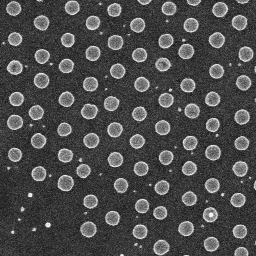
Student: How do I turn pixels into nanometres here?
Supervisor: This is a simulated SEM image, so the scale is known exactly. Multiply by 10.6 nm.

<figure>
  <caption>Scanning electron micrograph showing a regular array of raised bodies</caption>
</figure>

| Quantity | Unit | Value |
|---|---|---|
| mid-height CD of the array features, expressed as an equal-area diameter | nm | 150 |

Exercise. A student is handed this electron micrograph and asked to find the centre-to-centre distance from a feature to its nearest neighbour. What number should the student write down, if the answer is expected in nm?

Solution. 276